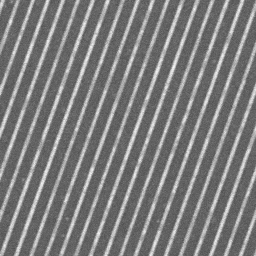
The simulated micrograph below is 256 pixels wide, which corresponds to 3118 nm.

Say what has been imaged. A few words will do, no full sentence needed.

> parallel lines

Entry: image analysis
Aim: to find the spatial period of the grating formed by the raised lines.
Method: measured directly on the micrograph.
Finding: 172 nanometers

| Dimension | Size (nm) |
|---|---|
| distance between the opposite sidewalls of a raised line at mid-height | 34.3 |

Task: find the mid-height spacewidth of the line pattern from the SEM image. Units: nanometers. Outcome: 139